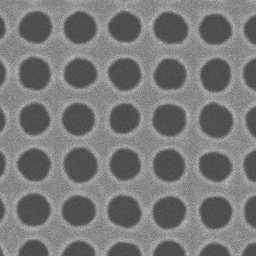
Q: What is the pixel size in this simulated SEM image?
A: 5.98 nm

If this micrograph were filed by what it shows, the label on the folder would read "a regular array of holes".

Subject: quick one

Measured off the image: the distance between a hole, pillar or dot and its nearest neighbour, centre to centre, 267 nanometres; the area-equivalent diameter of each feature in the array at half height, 0.2 um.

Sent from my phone